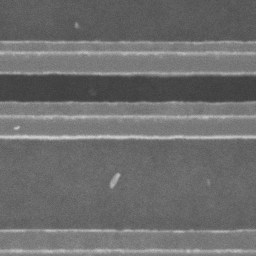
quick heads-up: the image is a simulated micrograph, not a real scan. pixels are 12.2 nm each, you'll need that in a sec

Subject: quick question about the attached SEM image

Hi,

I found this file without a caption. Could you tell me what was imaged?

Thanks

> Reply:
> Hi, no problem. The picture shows lines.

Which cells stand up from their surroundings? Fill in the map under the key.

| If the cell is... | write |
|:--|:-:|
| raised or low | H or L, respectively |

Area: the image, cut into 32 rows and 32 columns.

LLLLLLLLLLLLLLLLLLLLLLLLLLLLLLLL
LLLLLLLLLLLLLLLLLLLLLLLLLLLLLLLL
LLLLLLLLLLLLLLLLLLLLLLLLLLLLLLLL
LLLLLLLLLLLLLLLLLLLLLLLLLLLLLLLL
LLLLLLLLLLLLLLLLLLLLLLLLLLLLLLLL
HHHHHHHHHHHHHHHHHHHHHHHHHHHHHHHH
HHHHHHHHHHHHHHHHHHHHHHHHHHHHHHHH
HHHHHHHHHHHHHHHHHHHHHHHHHHHHHHHH
HHHHHHHHHHHHHHHHHHHHHHHHHHHHHHHH
LLLLLLLLLLLLLLLLLLLLLLLLLLLLLLLL
LLLLLLLLLLLLLLLLLLLLLLLLLLLLLLLL
LLLLLLLLLLLLLLLLLLLLLLLLLLLLLLLL
LLLLLLLLLLLLLLLLLLLLLLLLLLLLLLLL
HHHHHHHHHHHHHHHHHHHHHHHHHHHHHHHH
HHHHHHHHHHHHHHHHHHHHHHHHHHHHHHHH
HHHHHHHHHHHHHHHHHHHHHHHHHHHHHHHH
HHHHHHHHHHHHHHHHHHHHHHHHHHHHHHHH
LLLLLLLLLLLLLLLLLLLLLLLLLLLLLLLL
LLLLLLLLLLLLLLLLLLLLLLLLLLLLLLLL
LLLLLLLLLLLLLLLLLLLLLLLLLLLLLLLL
LLLLLLLLLLLLLLLLLLLLLLLLLLLLLLLL
LLLLLLLLLLLLLLLLLLLLLLLLLLLLLLLL
LLLLLLLLLLLLLLLLLLLLLLLLLLLLLLLL
LLLLLLLLLLLLLLLLLLLLLLLLLLLLLLLL
LLLLLLLLLLLLLLLLLLLLLLLLLLLLLLLL
LLLLLLLLLLLLLLLLLLLLLLLLLLLLLLLL
LLLLLLLLLLLLLLLLLLLLLLLLLLLLLLLL
LLLLLLLLLLLLLLLLLLLLLLLLLLLLLLLL
LLLLLLLLLLLLLLLLLLLLLLLLLLLLLLLL
HHHHHHHHHHHHHHHHHHHHHHHHHHHHHHHH
HHHHHHHHHHHHHHHHHHHHHHHHHHHHHHHH
HHHHHHHHHHHHHHHHHHHHHHHHHHHHHHHH